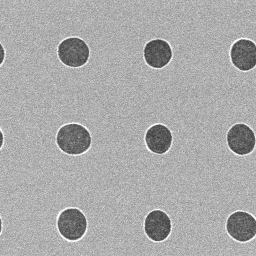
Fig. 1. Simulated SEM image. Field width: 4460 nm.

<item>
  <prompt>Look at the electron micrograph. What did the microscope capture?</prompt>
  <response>holes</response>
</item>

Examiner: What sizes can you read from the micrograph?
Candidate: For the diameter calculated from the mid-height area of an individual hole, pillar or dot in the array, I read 0.521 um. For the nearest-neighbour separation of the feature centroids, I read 1470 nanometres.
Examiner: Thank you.